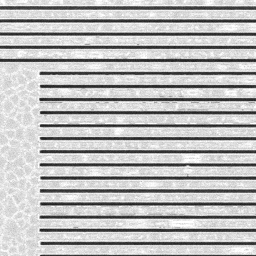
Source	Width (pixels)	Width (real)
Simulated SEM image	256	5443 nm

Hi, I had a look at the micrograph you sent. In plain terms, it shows parallel lines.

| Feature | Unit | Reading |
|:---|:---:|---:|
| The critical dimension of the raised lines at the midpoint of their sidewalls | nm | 202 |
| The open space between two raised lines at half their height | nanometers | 79.7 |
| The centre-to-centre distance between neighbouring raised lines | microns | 0.278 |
